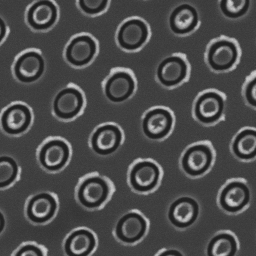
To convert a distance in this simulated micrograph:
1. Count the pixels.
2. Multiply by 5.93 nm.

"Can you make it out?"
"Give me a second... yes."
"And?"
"a regular array of ring-shaped grooves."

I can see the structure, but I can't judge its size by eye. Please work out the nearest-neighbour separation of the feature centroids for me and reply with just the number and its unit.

310 nm